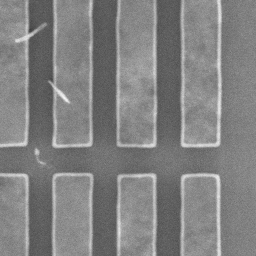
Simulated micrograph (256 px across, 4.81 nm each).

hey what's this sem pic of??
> groups of lines, slits or small figures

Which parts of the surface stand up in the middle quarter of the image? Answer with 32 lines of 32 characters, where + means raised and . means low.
+++++++.......+++++++++......+++
+++++++......++++++++++.......++
+++++++......++++++++++.......++
+++++++......++++++++++.......++
+++++++......++++++++++.......++
+++++++......++++++++++.......++
+++++++......++++++++++......+++
+++++++......++++++++++......+++
+++++++......++++++++++......+++
+++++++......++++++++++......+++
+++++++......++++++++++......+++
+++++++......++++++++++......+++
+++++++......++++++++++.......++
+++++++......++++++++++.......++
+++++++.......+++++++++.......++
+++++++.......+++++++++.......++
+++++++.......+++++++++.......++
+++++++......++++++++++.......++
+++++++......++++++++++......+++
+++++++.......+++++++++......+++
................................
................................
................................
................................
................................
................................
................................
................................
+++++++.......+++++++++.......++
+++++++.......+++++++++......+++
+++++++.......+++++++++......+++
+++++++.......+++++++++......+++